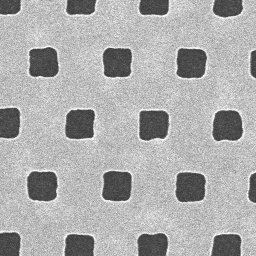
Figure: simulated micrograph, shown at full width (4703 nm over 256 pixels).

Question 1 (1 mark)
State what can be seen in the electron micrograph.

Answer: a regular array of holes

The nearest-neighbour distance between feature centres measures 1320 nanometres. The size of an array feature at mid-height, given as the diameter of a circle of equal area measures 597 nm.